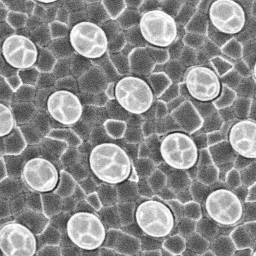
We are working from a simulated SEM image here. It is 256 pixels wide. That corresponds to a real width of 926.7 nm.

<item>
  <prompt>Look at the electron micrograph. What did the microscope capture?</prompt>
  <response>a regular array of raised bodies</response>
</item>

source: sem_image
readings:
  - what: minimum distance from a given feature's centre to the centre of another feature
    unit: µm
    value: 0.254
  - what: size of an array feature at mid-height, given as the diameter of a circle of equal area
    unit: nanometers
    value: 125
